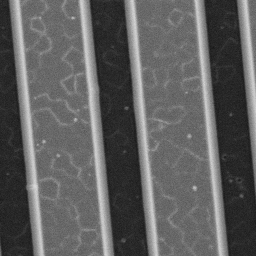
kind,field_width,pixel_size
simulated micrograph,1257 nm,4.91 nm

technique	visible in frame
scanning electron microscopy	one or a few lines or trenches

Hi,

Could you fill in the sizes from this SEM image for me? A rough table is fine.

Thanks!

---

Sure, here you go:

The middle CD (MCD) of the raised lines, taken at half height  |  356 nanometres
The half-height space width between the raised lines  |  41.1 px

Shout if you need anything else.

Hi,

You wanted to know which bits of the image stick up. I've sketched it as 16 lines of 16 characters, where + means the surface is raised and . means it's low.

.++++...+++++..+
.+++++..+++++..+
.+++++..+++++..+
.+++++..+++++..+
.+++++..+++++..+
.+++++...++++...
.+++++...++++...
..++++...++++...
..++++...++++...
..++++...++++...
..++++...+++++..
..++++...+++++..
..+++++..+++++..
..+++++..+++++..
..+++++..+++++..
..+++++..+++++..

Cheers